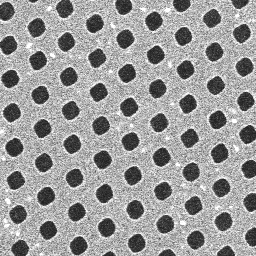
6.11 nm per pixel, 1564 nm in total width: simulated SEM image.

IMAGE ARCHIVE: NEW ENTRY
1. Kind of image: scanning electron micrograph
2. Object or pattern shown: a regular array of holes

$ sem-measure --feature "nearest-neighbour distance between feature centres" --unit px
33.4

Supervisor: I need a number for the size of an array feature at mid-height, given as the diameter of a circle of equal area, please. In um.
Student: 0.11